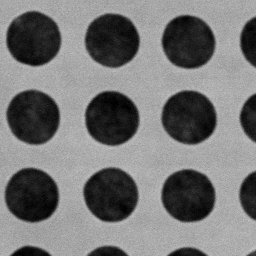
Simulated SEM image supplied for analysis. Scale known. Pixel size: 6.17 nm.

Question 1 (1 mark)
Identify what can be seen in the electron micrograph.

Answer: a regular array of holes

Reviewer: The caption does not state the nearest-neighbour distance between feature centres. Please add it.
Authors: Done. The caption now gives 472 nm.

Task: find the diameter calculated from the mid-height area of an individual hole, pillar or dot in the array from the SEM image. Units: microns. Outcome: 0.337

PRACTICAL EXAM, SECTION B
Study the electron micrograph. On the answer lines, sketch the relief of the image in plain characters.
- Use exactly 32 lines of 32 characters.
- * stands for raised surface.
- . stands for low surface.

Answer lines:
********************************
***..***************************
**.....*****....*****....******.
*......****......****.....****..
*.......***......***.......***..
*.......***......***.......***..
*......****......****......***..
**....******....*****.....*****.
***********************..*******
********************************
********************************
***..********..*******...*******
*......****.....*****.....*****.
*......****......***.......***..
*......****......***.......***..
*......****......***.......***..
*......****......****......****.
**....******....******....*****.
********************************
********************************
********************************
**....******....******...*******
*......****......****.....****..
*......***.......***.......***..
*......***.......***.......***..
*......****......***.......***..
*......****......****.....*****.
***..*******...*******...*******
********************************
********************************
********************************
**....*****.....******...******.